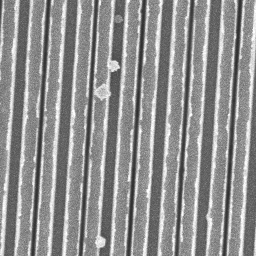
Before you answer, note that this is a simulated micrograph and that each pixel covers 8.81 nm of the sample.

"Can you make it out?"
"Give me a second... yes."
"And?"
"parallel lines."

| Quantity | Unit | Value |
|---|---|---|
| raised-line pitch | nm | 207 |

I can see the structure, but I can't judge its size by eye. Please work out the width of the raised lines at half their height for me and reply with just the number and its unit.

15.5 pixels